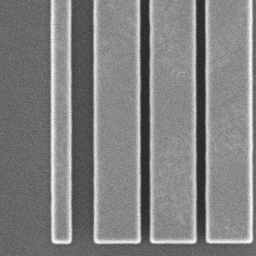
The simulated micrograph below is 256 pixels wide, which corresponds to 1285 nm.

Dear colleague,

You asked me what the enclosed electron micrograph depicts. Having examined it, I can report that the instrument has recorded groups of lines, slits or small figures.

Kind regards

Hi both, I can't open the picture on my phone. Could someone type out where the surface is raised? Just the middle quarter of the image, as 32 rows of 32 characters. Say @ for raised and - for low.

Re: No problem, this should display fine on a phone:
@@------@@@@@@@@@@@---@@@@@@@@@@
@@------@@@@@@@@@@@---@@@@@@@@@@
@@------@@@@@@@@@@@---@@@@@@@@@@
@@------@@@@@@@@@@@---@@@@@@@@@@
@@------@@@@@@@@@@@---@@@@@@@@@@
@@------@@@@@@@@@@@---@@@@@@@@@@
@@------@@@@@@@@@@@---@@@@@@@@@@
@@------@@@@@@@@@@@---@@@@@@@@@@
@@------@@@@@@@@@@@---@@@@@@@@@@
@@------@@@@@@@@@@@---@@@@@@@@@@
@@------@@@@@@@@@@@---@@@@@@@@@@
@@------@@@@@@@@@@@---@@@@@@@@@@
@@------@@@@@@@@@@@---@@@@@@@@@@
@@------@@@@@@@@@@@---@@@@@@@@@@
@@------@@@@@@@@@@@---@@@@@@@@@@
@@------@@@@@@@@@@@---@@@@@@@@@@
@@------@@@@@@@@@@@---@@@@@@@@@@
@@------@@@@@@@@@@@---@@@@@@@@@@
@@------@@@@@@@@@@@---@@@@@@@@@@
@@------@@@@@@@@@@@---@@@@@@@@@@
@@------@@@@@@@@@@@---@@@@@@@@@@
@@------@@@@@@@@@@@---@@@@@@@@@@
@@------@@@@@@@@@@@---@@@@@@@@@@
@@------@@@@@@@@@@@---@@@@@@@@@@
@@------@@@@@@@@@@@---@@@@@@@@@@
@@------@@@@@@@@@@@---@@@@@@@@@@
@@------@@@@@@@@@@@---@@@@@@@@@@
@@------@@@@@@@@@@@---@@@@@@@@@@
@@------@@@@@@@@@@@---@@@@@@@@@@
@@------@@@@@@@@@@@---@@@@@@@@@@
@@------@@@@@@@@@@@---@@@@@@@@@@
@@------@@@@@@@@@@@---@@@@@@@@@@